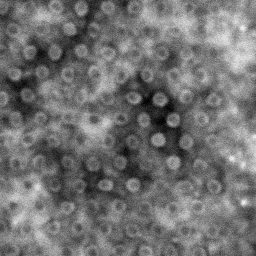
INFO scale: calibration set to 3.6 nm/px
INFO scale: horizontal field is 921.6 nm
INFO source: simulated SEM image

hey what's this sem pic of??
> a regular array of raised bodies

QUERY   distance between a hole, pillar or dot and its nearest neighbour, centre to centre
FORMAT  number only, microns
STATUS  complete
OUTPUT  0.088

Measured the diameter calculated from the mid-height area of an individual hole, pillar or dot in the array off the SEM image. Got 44.5 nm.